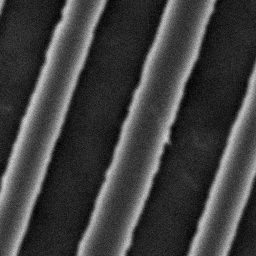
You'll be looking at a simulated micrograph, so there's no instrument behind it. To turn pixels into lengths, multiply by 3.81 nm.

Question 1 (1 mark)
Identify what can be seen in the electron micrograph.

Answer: lines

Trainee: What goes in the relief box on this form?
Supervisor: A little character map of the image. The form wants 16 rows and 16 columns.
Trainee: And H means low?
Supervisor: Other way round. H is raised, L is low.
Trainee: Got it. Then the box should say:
LLLLHHLLLLHHHLLL
LLLLHHLLLLHHHLLL
LLLHHHLLLLHHHLLL
LLLHHLLLLHHHLLLL
LLLHHLLLLHHHLLLL
LLHHHLLLLHHLLLLL
LLHHLLLLHHHLLLLH
LHHHLLLLHHHLLLLH
LHHHLLLLHHLLLLHH
LHHLLLLHHHLLLLHH
HHHLLLLHHHLLLLHH
HHHLLLHHHLLLLHHH
HHLLLLHHHLLLLHHL
HHLLLLHHHLLLLHHL
HHLLLHHHLLLLHHHL
HLLLLHHHLLLLHHLL